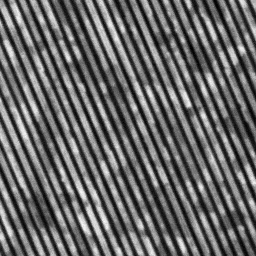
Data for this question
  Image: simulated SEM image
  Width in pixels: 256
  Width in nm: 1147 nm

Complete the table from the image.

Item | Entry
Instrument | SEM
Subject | parallel lines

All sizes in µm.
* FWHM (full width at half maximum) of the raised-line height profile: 0.0212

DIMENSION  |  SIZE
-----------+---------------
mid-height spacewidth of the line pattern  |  25.2 nm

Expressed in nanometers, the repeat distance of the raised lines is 45.5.